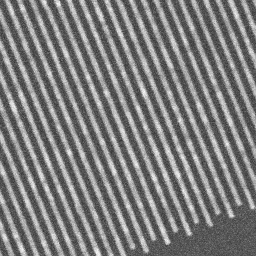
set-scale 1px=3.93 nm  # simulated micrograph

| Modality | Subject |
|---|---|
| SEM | parallel lines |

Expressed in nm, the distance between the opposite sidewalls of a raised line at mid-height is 14.5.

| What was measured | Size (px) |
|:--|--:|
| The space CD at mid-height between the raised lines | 7.4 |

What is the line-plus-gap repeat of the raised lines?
45.1 nanometers